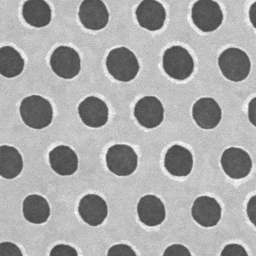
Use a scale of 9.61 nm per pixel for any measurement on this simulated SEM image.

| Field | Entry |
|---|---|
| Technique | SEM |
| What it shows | a regular array of holes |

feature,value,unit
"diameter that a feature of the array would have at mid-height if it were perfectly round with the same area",307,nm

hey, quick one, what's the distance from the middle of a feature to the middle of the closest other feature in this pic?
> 535 nm